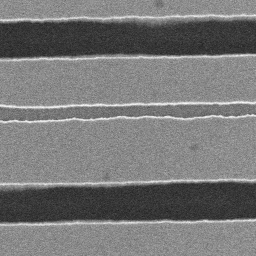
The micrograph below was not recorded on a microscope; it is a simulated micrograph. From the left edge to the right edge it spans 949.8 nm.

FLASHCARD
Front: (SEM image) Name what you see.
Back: lines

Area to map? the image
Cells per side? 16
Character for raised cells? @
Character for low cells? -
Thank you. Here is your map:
@@@@@@@@@@@@@@@@
----------------
----------------
--------------@@
@@@@@@@@@@@@@@@@
@@@@@@@@@@@@@@@@
@@@@@@@@@@@@@@@@
@@@@@@@@@@@@@@@@
@@@@@@@@@@@@@@@@
@@@@@@@@@@@@@@@@
@@@@@@@@@@@@@@@@
@@@-------------
----------------
----------------
@@@@@@@@@@@@@@@@
@@@@@@@@@@@@@@@@